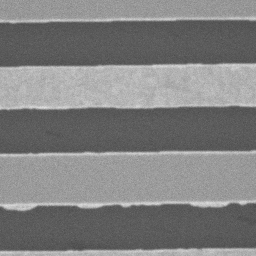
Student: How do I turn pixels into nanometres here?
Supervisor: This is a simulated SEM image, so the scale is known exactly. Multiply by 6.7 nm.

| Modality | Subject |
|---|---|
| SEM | lines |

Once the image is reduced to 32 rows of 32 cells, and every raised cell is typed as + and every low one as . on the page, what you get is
++++++++++++++++++++++++++++++++
++++++++++++++++++++++++++++++++
++++++++++++++..................
................................
................................
................................
................................
................................
++++++++++++++++++++++++++++++++
++++++++++++++++++++++++++++++++
++++++++++++++++++++++++++++++++
++++++++++++++++++++++++++++++++
++++++++++++++++++++++++++++++++
++..............................
................................
................................
................................
................................
................................
++++++++++++++++++++++++++++++++
++++++++++++++++++++++++++++++++
++++++++++++++++++++++++++++++++
++++++++++++++++++++++++++++++++
++++++++++++++++++++++++++++++++
++++++++++++++++++++++++++++++++
++++++++++++++..................
................................
................................
................................
................................
................................
..++++++++++++++++++++++++++++++